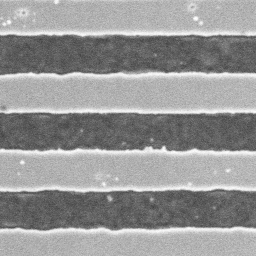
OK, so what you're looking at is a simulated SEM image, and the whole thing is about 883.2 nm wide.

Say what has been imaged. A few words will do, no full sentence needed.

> lines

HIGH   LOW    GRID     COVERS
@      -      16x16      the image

@@@@@@@@@@@@@@@@
@@@@@@@@@@@@@@@@
----------------
----------------
----------------
@@@@@@@@@@@@@@@@
@@@@@@@@@@@@@@@@
----------------
----------------
@@@@@@@@@@@@@@@@
@@@@@@@@@@@@@@@@
@@@@@@@@@@@@@@@@
----------------
@---------------
@@@@@@@@@@@@@@@@
@@@@@@@@@@@@@@@@